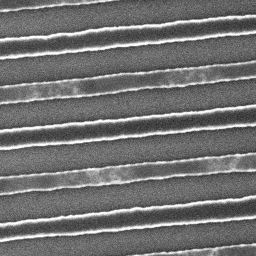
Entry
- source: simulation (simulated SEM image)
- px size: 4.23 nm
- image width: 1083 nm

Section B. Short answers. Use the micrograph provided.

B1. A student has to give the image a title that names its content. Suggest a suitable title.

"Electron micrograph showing lines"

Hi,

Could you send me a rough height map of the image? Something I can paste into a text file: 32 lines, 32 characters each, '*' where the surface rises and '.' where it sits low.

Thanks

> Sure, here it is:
**********......................
................................
.........................*******
...............*****************
......*********************.....
******************..............
*********.......................
................................
.........................*******
.............*******************
....********************........
***************.................
*****...........................
.............................***
...................*************
.........***********************
**********************..........
*************...................
**..............................
............................****
..................**************
........********************....
******************..............
*******.........................
................................
........................********
.............*******************
....*************************...
*****************...............
******..........................
................................
......................**********